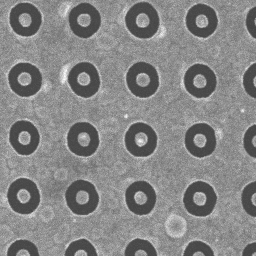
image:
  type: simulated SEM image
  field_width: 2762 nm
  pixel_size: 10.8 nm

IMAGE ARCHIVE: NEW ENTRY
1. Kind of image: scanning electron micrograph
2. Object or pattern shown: a regular array of ring-shaped grooves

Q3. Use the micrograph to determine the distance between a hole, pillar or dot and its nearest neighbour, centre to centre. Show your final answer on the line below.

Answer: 624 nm